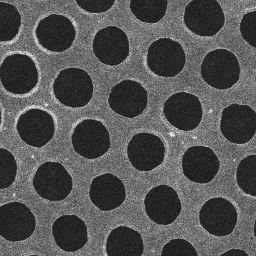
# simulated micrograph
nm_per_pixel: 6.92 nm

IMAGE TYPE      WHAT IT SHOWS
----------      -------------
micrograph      a regular array of holes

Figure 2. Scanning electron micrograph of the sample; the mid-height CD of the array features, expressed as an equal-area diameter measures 265 nanometers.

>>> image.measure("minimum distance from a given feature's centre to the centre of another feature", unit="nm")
382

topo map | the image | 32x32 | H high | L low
LHHHHHHHHHLLLLHHLLLLLHHHLLLHHHHH
LLHHHHHHHHHLLHHHHLLLLHHLLLLLHHHL
LLLHHLLLLHHHHHHHHLLLHHHLLLLLHHLL
LLHHHLLLLHHHHLLHHHHHHHHHLLLLHHLL
LLHHHLLLLHHHLLLLHHHHHHHHHLHHHHLL
HHHHHLLLLHHHLLLLHHHLLLHHHHHHHHHL
HHHHHHHHHHHHLLLLHHLLLLLHHHLLLHHH
HLLLHHHHHHHHLLLLHHLLLLLHHLLLLLHH
LLLLLHHHHLHHHHHHHHHLLLLHHLLLLLHH
LLLLLHHLLLLHHHHHHHHHLLHHHLLLLLHH
LLLLLHHLLLLLHHHLLHHHHHHHHHLLLHHH
HLLLHHHLLLLLHHLLLLHHHHHHHHHHHHHH
HHHHHHHLLLLHHHLLLLHHHLLLLHHHHHHH
HHHHHHHHHHHHHHLLLLHHLLLLLHHHLLLH
HHHLLLHHHHHHHHHLLHHHHLLLLHHHLLLL
HHLLLLLHHHLLLHHHHHHHHLLLLHHHLLLL
HHLLLLLHHLLLLLHHHHHHHHHHHHHHLLLL
HHHLLLHHHLLLLLHHLLLLHHHHHHHHHLLH
HHHHHHHHHLLLLLHHLLLLLHHHLLHHHHHH
LLHHHHHHHHLLLHHHLLLLLHHLLLLHHHHL
LLHHHLLLHHHHHHHHLLLLHHHLLLLHHHLL
LLHHHLLLHHHHHHHHHHHHHHHLLLLHHHLL
LLHHLLLLLHHHLLLHHHHHHHHHLLHHHHLL
LHHHLLLLLHHLLLLLHHHLLHHHHHHHHHLL
HHHHHLLLHHHLLLLLHHLLLLHHHHHHHHHH
HLLHHHHHHHHHLLLHHHLLLLLHHHLLLHHH
LLLLHHHHHHHHHHHHHHLLLLLHHLLLLLHH
LLLLHHHLLLHHHHHHHHHLLLHHHLLLLLHH
LLLLHHHLLLLHHHLLHHHHHHHHHHLLLHHH
LLLLHHHLLLLHHHLLLLHHHHHHHHHHHHHH
HHHHHHHLLLLHHLLLLLHHHLLLHHHHHHHH
HHHHHHHHHHHHHLLLLLHHLLLLLHHHLLLH